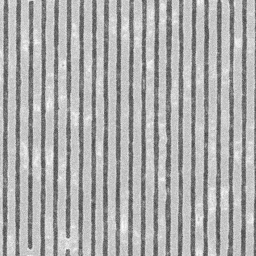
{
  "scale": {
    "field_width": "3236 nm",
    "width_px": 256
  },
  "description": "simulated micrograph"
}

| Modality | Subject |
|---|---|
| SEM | parallel lines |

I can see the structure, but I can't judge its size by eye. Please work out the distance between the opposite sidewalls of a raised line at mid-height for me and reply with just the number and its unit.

99.6 nm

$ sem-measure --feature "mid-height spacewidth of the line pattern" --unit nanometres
60.1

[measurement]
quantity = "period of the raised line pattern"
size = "159 nanometres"